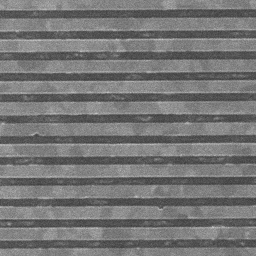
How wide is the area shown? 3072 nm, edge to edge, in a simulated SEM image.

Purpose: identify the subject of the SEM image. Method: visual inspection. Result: parallel lines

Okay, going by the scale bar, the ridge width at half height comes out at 12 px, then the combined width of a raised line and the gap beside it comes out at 20.9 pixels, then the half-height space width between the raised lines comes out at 111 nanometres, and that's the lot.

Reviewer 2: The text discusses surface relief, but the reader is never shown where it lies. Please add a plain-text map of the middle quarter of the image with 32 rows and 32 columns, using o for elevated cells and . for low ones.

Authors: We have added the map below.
oooooooooooooooooooooooooooooooo
oooooooooooooooooooooooooooooooo
................................
................................
....................oooooooooooo
oooooooooooooooooooooooooooooooo
oooooooooooooooooooooooooooooooo
................................
................................
................................
oooooooooooooooooooooooooooooooo
oooooooooooooooooooooooooooooooo
.ooo....o...................oo.o
................................
................................
oooooooooooooooooooooooooooooooo
oooooooooooooooooooooooooooooooo
oooooooooooooooooooooooooooooooo
................................
................................
oooooooooooooooooooooooooooooooo
oooooooooooooooooooooooooooooooo
oooooooooooooooooooooooooooooooo
................................
................................
oooooooooooooooooooooooooooooooo
oooooooooooooooooooooooooooooooo
oooooooooooooooooooooooooooooooo
................................
................................
..............oooooooooooooooooo
oooooooooooooooooooooooooooooooo